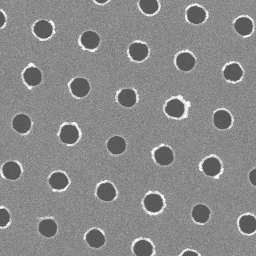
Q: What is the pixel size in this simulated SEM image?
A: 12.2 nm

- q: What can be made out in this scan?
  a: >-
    a regular array of holes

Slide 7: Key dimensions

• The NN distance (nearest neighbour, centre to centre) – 584 nm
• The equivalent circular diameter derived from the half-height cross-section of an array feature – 228 nanometers